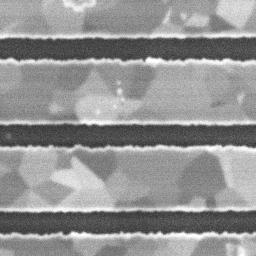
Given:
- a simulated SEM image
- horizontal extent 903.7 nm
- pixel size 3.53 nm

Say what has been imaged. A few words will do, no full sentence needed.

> lines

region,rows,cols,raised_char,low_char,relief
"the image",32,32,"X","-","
XXXXXXXXXXXXXXXXXXXXXXXXXXXXXXXX
XXXXXXXXXXXXXXXXXXXXXXXXXXXXXXXX
XXXXXXXXXXXXXXXXXXXXXXXXXXXXXXXX
XXXXXXXXXXXXXXXXXXXXXXXXXXXXXXXX
XXXXXXXXXXXXXXXXXXXXXXXXXXXXXX-X
--------------------------------
--------------------------------
-X---X-----X-X----XX-----X--X---
XXXXXXXXXXXXXXXXXXXXXXXXXXXXXXXX
XXXXXXXXXXXXXXXXXXXXXXXXXXXXXXXX
XXXXXXXXXXXXXXXXXXXXXXXXXXXXXXXX
XXXXXXXXXXXXXXXXXXXXXXXXXXXXXXXX
XXXXXXXXXXXXXXXXXXXXXXXXXXXXXXXX
XXXXXXXXXXXXXXXXXXXXXXXXXXXXXXXX
XXXXXXXXXXXXXXXXXXXXXXXXXXXXXXXX
X----------------------X--XXX---
--------------------------------
--------------------------------
XXXXXXXX-XX--XXXXXXXXXXXXXXXXXX-
XXXXXXXXXXXXXXXXXXXXXXXXXXXXXXXX
XXXXXXXXXXXXXXXXXXXXXXXXXXXXXXXX
XXXXXXXXXXXXXXXXXXXXXXXXXXXXXXXX
XXXXXXXXXXXXXXXXXXXXXXXXXXXXXXXX
XXXXXXXXXXXXXXXXXXXXXXXXXXXXXXXX
XXXXXXXXXXXXXXXXXXXXXXXXXXXXXXXX
XXXXXXXXXXXXXXXXXXXXXXXXXXXXXXXX
--------------------------------
--------------------------------
--------------------------------
XXXXXXXXXXXXXXXXXXXXXXXXXXXXXXXX
XXXXXXXXXXXXXXXXXXXXXXXXXXXXXXXX
XXXXXXXXXXXXXXXXXXXXXXXXXXXXXXXX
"